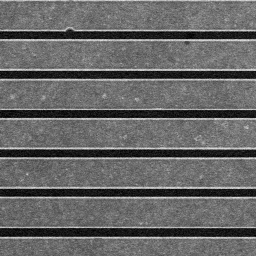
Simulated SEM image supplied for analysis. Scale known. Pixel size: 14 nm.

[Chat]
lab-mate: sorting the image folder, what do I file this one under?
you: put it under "parallel lines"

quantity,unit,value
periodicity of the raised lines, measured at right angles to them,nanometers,549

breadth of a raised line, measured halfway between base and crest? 0.415 µm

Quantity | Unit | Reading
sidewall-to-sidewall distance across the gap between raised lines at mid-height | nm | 134